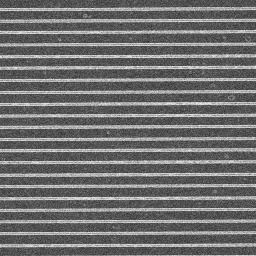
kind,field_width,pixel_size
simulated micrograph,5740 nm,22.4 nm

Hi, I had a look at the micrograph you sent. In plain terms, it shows parallel lines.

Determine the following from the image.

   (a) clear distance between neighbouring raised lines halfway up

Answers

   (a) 9.75 pixels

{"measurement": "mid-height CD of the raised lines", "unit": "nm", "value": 44.8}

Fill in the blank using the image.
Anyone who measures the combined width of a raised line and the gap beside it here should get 265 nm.